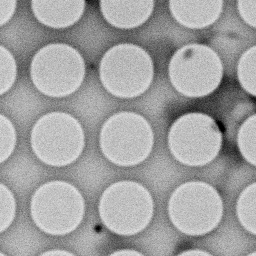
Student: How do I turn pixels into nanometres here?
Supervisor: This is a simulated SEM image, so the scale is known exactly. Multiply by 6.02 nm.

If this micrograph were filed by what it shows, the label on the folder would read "an array of small figures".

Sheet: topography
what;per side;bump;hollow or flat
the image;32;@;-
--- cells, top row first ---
@@--@@@@@@---@@@@@@--@@@@@@@--@@
@@--@@@@@@---@@@@@@---@@@@@---@@
@----@@@@@---@@@@@----@@@@@----@
--------------------------------
--------------------------------
--------------------------------
@----@@@@@----@@@@----@@@@@----@
@@--@@@@@@---@@@@@@--@@@@@@---@@
@@--@@@@@@---@@@@@@--@@@@@@@--@@
@@--@@@@@@---@@@@@@--@@@@@@@--@@
@---@@@@@@---@@@@@@---@@@@@---@@
-----@@@@-----@@@@-----@@@-----@
--------------------------------
--------------------------------
------@@@-----@@@------@@@------
@----@@@@@---@@@@@----@@@@@---@@
@@--@@@@@@---@@@@@@--@@@@@@---@@
@@--@@@@@@---@@@@@@--@@@@@@@--@@
@@--@@@@@@---@@@@@@--@@@@@@---@@
@----@@@@@---@@@@@----@@@@@---@@
------@@-------@@------@@-------
--------------------------------
--------------------------------
@----@@@@-----@@@@----@@@@-----@
@---@@@@@@---@@@@@@---@@@@@---@@
@@--@@@@@@---@@@@@@--@@@@@@@--@@
@@--@@@@@@---@@@@@@--@@@@@@@--@@
@---@@@@@@---@@@@@@---@@@@@---@@
@----@@@@-----@@@@----@@@@@----@
--------------------------------
--------------------------------
------@@-------@@------@@-------